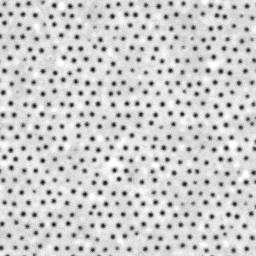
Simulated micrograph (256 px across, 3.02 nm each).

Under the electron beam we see a regular array of holes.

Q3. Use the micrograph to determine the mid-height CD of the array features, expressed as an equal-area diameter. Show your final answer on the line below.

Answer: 13.6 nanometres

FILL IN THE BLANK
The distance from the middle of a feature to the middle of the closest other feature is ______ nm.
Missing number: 32.4